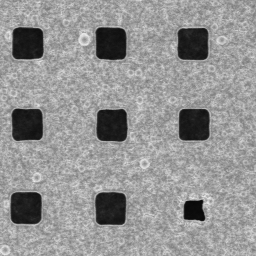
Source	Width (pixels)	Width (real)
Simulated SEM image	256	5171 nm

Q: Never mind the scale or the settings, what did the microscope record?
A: a regular array of holes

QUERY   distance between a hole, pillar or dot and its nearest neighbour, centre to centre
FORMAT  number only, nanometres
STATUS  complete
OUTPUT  1650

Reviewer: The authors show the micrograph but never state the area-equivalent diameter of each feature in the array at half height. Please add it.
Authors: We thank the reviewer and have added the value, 34.7 px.